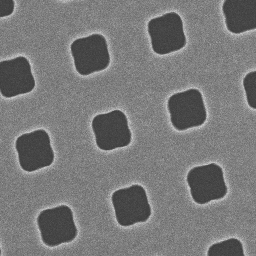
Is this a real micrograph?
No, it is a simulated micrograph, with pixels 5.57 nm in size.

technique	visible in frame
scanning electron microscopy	a regular array of holes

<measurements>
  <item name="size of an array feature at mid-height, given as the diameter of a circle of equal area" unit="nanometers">216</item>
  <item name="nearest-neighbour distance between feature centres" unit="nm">430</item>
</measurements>